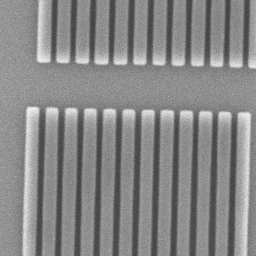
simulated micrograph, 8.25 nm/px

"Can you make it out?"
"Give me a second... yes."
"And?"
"groups of lines, slits or small figures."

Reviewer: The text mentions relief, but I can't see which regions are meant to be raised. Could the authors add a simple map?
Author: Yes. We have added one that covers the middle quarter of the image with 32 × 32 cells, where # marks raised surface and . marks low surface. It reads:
................................
................................
................................
................................
................................
................................
................................
................................
................................
................................
................................
.##..###..###...................
###..###..###..###..##..###..###
###..###..###..###..##..###..###
###..###..###..###..##..###..###
###..###..###..###.###..###..###
###..###..###..###.###..###..###
###..###..###..###.###..###..###
###..###..###..##..###..###..###
###..###..###..##..###..###..###
###..###..###..##..###..###..###
###..###..###..##..###..###..###
###..###..###..##..###..###..###
###..###..###..##..###..###..###
###..###..###.###..###..###..###
###..###.####.###..###..###..###
###..###.####.###..###..###..###
###..###.###..###..###..###..###
###..###.###..###..###..###..###
###..###.###..###..###..###..###
###..###.###..###..###..###..###
###..###.###..###..###..###..###